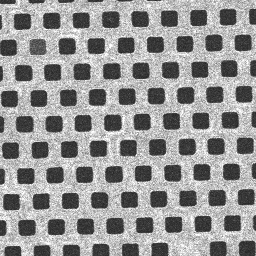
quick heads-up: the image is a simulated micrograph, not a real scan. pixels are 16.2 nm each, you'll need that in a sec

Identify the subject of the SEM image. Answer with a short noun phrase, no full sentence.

a regular array of holes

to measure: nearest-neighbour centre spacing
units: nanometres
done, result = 470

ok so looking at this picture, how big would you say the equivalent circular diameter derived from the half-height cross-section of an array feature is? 297 nanometres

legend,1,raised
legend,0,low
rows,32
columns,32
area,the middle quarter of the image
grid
11000011110000111000011100000111
11000001110000111000011100000111
11000001110000111000011100000111
11100001110000111000011110001111
11111111111111111111111111111111
11111111111111111111111111111111
00011110001111000011100001110000
00011100000111000011100001110000
00011100000111000011100001110000
00011100001111000011100001111000
00111110001111111111111111111111
11111111111111111111111111111111
11111111111001111100011110000111
11100001110000111000001110000111
11100001110000111000001110000111
11100001110000111000001110000111
11100001110000111100011111111111
11111111111111111111111111111111
11111111111111111111111111111111
00011110000111000011100001111000
00001100000111000011100000111000
00001100000111000011100000111000
00011110000111000011100001111000
11111111111111111111111111111111
11111111111111111111111111111111
11111111111100111110001110000111
11100001110000011100001110000111
11100001110000011100001110000111
11100001110000011100001110000111
11100001111000111110111111111111
11111111111111111111111111111111
11111111111111111111111111111100